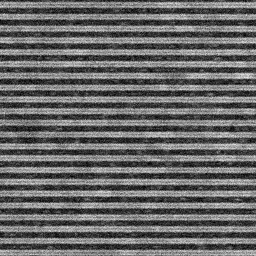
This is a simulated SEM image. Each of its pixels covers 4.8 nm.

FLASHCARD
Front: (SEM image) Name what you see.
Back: parallel lines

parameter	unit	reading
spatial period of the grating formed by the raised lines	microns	0.0566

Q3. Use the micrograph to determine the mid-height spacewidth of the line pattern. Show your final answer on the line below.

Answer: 38.4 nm